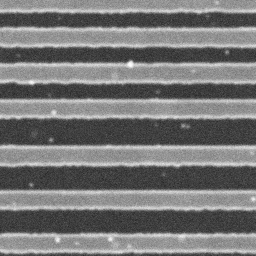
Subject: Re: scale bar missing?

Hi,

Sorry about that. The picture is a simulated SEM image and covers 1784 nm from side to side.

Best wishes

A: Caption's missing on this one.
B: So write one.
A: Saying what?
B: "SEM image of lines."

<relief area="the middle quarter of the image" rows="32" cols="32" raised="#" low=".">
################################
################################
################################
################################
################################
................................
................................
................................
................................
################################
################################
################################
################################
##.#.######...#.####.###########
................................
................................
................................
................................
................................
................................
..........##...##......#........
################################
################################
################################
################################
............................#...
................................
................................
................................
................................
................................
................................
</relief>